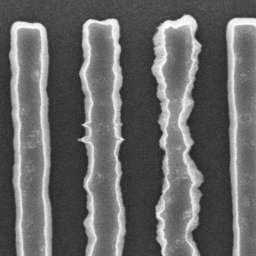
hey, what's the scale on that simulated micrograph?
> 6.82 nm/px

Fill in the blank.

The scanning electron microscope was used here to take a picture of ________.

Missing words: one or a few lines or trenches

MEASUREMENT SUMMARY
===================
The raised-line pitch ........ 0.496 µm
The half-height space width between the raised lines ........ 293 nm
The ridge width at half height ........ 201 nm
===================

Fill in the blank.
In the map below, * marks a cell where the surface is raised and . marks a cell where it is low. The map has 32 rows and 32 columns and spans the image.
................................
................................
................................
..***......***......****.....***
..****.....***......****.....***
..****.....****.....****.....***
..***......****.....*****....***
..***......****.....****.....***
..****....*****.....****.....***
..***.....*****.....****.....***
..***......****.....****.....***
..***......****.....***......***
..***......****......***.....***
..***......****......**......***
..***......****......**......***
..***......****.....***......***
..****.....****.....***......***
..****.....****.....****.....***
..****.....****......***.....***
..****.....****......**......***
..****.....****......***.....***
..****.....****......***.....***
..****.....****......****....***
..****.....****......***.....***
..****.....****.....****.....***
..****.....****.....****.....***
..****.....****.....****.....***
..****.....****.....****.....***
..****.....****.....****.....***
..****.....****.....***.......**
..****.....****.....****......**
...***.....****.....****......**